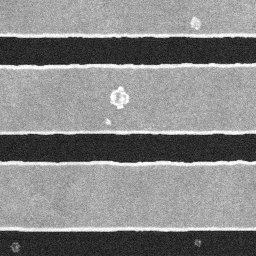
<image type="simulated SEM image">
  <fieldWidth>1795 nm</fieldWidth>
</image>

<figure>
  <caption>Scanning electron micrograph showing lines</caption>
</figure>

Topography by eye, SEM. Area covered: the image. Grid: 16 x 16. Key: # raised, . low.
################
################
................
................
################
################
################
################
................
................
################
################
################
################
................
................